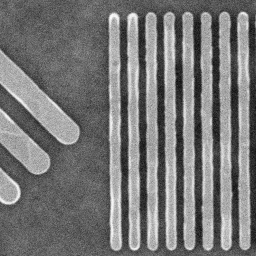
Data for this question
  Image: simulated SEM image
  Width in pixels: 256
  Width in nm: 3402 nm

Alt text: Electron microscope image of groups of lines, slits or small figures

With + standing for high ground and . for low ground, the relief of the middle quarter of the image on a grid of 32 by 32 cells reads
............++..++...++..++...++
...........+++..++...++..++...++
...........+++..++...++..+++..++
............++..++...++..+++..++
............++..++...++..+++..++
............++..++...++..+++..++
............++...+...++..+++..++
............++..++...++..+++..++
............++..++...++..++...++
............++..++...++..++...++
............++..++...++..++...++
............++..++...++..++...++
............++..++...++..+++..++
+...........++..++...++..+++..++
++..........++..++...++..+++..++
+++.........++..++...++..+++..++
++++........++..++...++..+++..++
++++........++...+...++..+++..++
+++.........++...++..++...++..++
+++.........++..+++..++...++..++
............++..+++..++..+++..++
............++..+++..++..+++..++
............++..+++..++..+++..++
............++..+++..++...++..++
............++..+++..++...++..++
............++..++...++...++..++
............++..++...++...++..++
............++..+++..++...++..++
............++..+++..++...++..++
............++...++..++...++..++
............++...++..++...++..++
............++...++..++...++..++